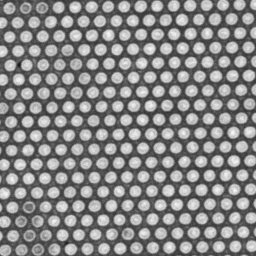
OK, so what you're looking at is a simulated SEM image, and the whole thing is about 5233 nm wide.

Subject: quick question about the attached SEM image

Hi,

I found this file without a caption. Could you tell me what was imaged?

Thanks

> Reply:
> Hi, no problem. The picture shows a regular array of raised bodies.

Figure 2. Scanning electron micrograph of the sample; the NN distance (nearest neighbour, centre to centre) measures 327 nm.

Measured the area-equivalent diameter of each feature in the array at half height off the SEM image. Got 0.228 µm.